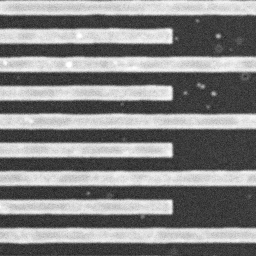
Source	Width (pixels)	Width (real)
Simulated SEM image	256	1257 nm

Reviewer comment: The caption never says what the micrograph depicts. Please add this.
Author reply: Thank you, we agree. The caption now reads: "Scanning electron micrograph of wiring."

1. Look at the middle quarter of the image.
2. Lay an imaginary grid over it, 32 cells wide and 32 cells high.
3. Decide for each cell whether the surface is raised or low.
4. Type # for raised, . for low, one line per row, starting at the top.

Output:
################################
.#####.........#######..........
................................
................................
................................
................................
##########################......
##########################......
............###.................
................................
................................
................................
................................
################################
################################
################################
................................
................................
................................
................................
###########################.....
###########################.....
###########################.....
................................
................................
................................
................................
#######..#######################
#######..#######################
################################
................................
................................